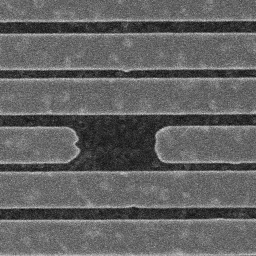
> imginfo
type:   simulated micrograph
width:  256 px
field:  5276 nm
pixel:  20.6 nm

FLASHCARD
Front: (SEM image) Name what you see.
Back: parallel lines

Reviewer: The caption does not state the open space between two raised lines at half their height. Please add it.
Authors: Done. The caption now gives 252 nm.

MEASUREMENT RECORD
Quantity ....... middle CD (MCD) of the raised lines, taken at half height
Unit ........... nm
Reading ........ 739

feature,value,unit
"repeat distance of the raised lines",950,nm